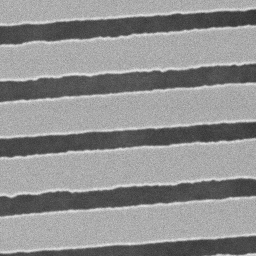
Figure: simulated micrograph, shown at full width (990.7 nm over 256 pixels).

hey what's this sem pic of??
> lines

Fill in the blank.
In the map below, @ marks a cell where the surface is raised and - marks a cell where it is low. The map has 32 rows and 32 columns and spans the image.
@@@@@@@@@@@@@@@@@@@@@@@@@@@@@@@@
@@@@@@@@@@@@@@@@@@@@@@@@@@------
@@@@@@@@@@@---------------------
--------------------------@@@@@@
----------------@@@@@@@@@@@@@@@@
--@@@@@@@@@@@@@@@@@@@@@@@@@@@@@@
@@@@@@@@@@@@@@@@@@@@@@@@@@@@@@@@
@@@@@@@@@@@@@@@@@@@@@@@@@@@@@@@@
@@@@@@@@@@@@@@@@@@@@@@@@--------
@@@@@@@@------------------------
------------------------------@@
----------------@@@@@@@@@@@@@@@@
----@@@@@@@@@@@@@@@@@@@@@@@@@@@@
@@@@@@@@@@@@@@@@@@@@@@@@@@@@@@@@
@@@@@@@@@@@@@@@@@@@@@@@@@@@@@@@@
@@@@@@@@@@@@@@@@@@@@@@@@@@@-----
@@@@@@@@@@@---------------------
------------------------------@@
----------------@@@@@@@@@@@@@@@@
---@@@@@@@@@@@@@@@@@@@@@@@@@@@@@
@@@@@@@@@@@@@@@@@@@@@@@@@@@@@@@@
@@@@@@@@@@@@@@@@@@@@@@@@@@@@@@@@
@@@@@@@@@@@@@@@@@@@@@@@@@@@@----
@@@@@@@@@@@@@@@-----------------
-@------------------------------
-------------------@@@@@@@@@@@@@
-------@@@@@@@@@@@@@@@@@@@@@@@@@
@@@@@@@@@@@@@@@@@@@@@@@@@@@@@@@@
@@@@@@@@@@@@@@@@@@@@@@@@@@@@@@@@
@@@@@@@@@@@@@@@@@@@@@@@@@@@@@@--
@@@@@@@@@@@@@@@@@@--------------
@@@@----------------------------